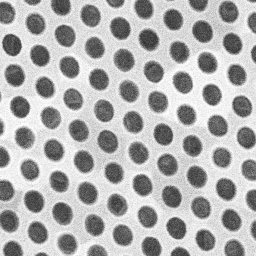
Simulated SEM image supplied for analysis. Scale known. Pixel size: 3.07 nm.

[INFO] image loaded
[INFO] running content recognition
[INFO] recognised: a regular array of holes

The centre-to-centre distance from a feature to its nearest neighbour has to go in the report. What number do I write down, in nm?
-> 94.9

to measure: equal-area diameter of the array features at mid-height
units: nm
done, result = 68.6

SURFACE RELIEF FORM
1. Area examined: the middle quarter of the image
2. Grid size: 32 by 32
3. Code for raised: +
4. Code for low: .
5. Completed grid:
....+++++++++....+++.....+++++++
....+++...++++...+++.....+++++++
....++.....+++++++++.....+++...+
+..+++.....+++++++++.....++.....
++++++.....+++....++++..+++.....
+++++++....+++.....++++++++.....
....++++..+++......+++++++++....
....++++++++++.....++....++++..+
.....+++++++++.....++.....++++++
.....+++...+++++..+++.....++++++
.....++.....+++++++++.....+++...
++..+++......+++++++++....++....
++++++++.....++....+++++++++....
++++++++....+++.....++++++++....
++...++++..++++.....+++++++++...
+.....+++++++++.....+++...++++..
+.....++++.++++.....++.....+++++
+.....+++....++++.++++.....+++++
++....++.....++++++++++....+++..
++++.+++......+++..++++....+++..
+++++++++.....++.....++++.++++..
++++.++++....+++.....+++++++++..
+++....+++++++++.....++++..++++.
++.....+++++++++.....+++....++++
++......+++..++++...+++.....++++
+++.....++....+++++++++......+++
+++....+++.....+++++++++.....++.
.+++++++++.....+++..++++....+++.
.+++++++++.....++....++++++++++.
..+++.+++++...+++.....+++++++++.
.++.....+++++++++.....++++..++++
.++.....+++++++++.....+++....+++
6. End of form